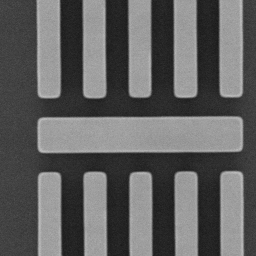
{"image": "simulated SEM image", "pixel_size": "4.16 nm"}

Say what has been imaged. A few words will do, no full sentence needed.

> groups of lines, slits or small figures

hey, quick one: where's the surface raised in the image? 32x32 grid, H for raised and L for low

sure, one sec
LLLLLHHLLLHHHLLLHHHLLLHHLLLHHHLL
LLLLLHHLLLHHHLLLHHHLLLHHLLLHHHLL
LLLLLHHLLLHHHLLLHHHLLLHHHLLHHHLL
LLLLLHHLLLHHHLLLHHHLLLHHHLLHHHLL
LLLLLHHLLLHHHLLLHHHLLLHHHLLHHHLL
LLLLLHHLLLHHHLLLHHHLLLHHHLLHHHLL
LLLLLHHLLLHHHLLLHHHLLLHHHLLHHHLL
LLLLLHHLLLHHHLLLHHHLLLHHHLLHHHLL
LLLLLHHHLLHHHLLLHHHLLLHHHLLHHHLL
LLLLLHHHLLHHHLLLHHHLLLHHHLLHHHLL
LLLLLHHLLLHHHLLLHHHLLLHHHLLHHHLL
LLLLLHHLLLHHHLLLHHHLLLHHHLLHHHLL
LLLLLLLLLLLLLLLLLLLLLLLLLLLLLLLL
LLLLLLLLLLLLLLLLLLLLLLLLLLLLLLLL
LLLLLLLLLLLLLLLLLLLLLLLLLLLLLLLL
LLLLLHHHHHHHHHHHHHHHHHHHHHHHHHLL
LLLLLHHHHHHHHHHHHHHHHHHHHHHHHHLL
LLLLLHHHHHHHHHHHHHHHHHHHHHHHHHLL
LLLLLHHHHHHHHHHHHHHHHHHHHHHHHHLL
LLLLLLLLLLLLLLLLLLLLLLLLLLLLLLLL
LLLLLLLLLLLLLLLLLLLLLLLLLLLLLLLL
LLLLLLLLLLLLLLLLLLLLLLHHLLLLHHLL
LLLLLHHHLLHHHLLLHHHLLLHHHLLLHHLL
LLLLLHHHLLHHHLLLHHHLLLHHHLLLHHLL
LLLLLHHHLLHHHLLLHHHLLLHHHLLLHHLL
LLLLLHHHLLHHHLLLHHHLLLHHHLLLHHLL
LLLLLHHHLLHHHLLLHHHLLLHHHLLLHHLL
LLLLLHHHLLLHHLLLHHHLLLHHHLLLHHLL
LLLLLHHHLLLHHLLLHHHLLLHHHLLLHHLL
LLLLLHHHLLLHHLLLHHHLLLHHHLLLHHLL
LLLLLHHHLLLHHLLLHHHLLLHHHLLLHHLL
LLLLLHHHLLLHHLLLHHHLLLHHHLLLHHLL